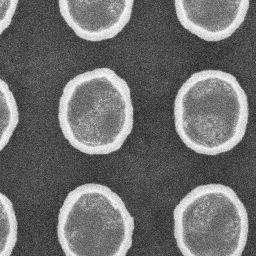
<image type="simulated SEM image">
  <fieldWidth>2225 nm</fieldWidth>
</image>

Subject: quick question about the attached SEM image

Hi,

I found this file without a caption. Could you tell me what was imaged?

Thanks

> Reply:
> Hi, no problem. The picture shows raised bodies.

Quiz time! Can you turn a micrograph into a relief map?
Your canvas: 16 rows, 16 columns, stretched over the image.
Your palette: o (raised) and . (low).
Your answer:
o...oooo...oooo.
.....ooo....ooo.
................
................
................
....oooo....ooo.
o...oooo...oooo.
o...oooo...oooo.
....oooo...oooo.
................
................
................
....ooo.....ooo.
o...oooo...oooo.
o...oooo...oooo.
o...oooo...oooo.